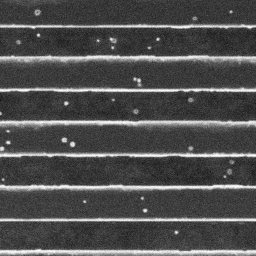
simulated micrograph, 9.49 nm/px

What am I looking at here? lines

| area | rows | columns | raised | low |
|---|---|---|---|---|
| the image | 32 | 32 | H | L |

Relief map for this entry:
HHHHHHHHHHHHHHHHHHHHHHHHHHHHHHHH
HHHHHHHHHHHHHHHHHHHHHHHHHHHHHHHH
HHHHHHHHHHHHHHHHHHHHHHHHHHHHHHHH
LLLLLLLLLLLLLLLLLLLLLLLLLLLLLLLL
LLLLLLLLLLLLLLLLLLLLLLLLLLLLLLLL
LLLLLLLLLLLLLLLLLLLLLLLLLLLLLLLL
LLLLLLLLLLLLLLLLLLLLLLLLLLLLLLLL
HHHHHHHHHHHHHHHHHHHHHHHHHHHHHHHH
HHHHHHHHHHHHHHHHHHHHHHHHHHHHHHHH
HHHHHHHHHHHHHHHHHHHHHHHHHHHHHHHH
HHHHHHHHHHHHHHHHHHHHHHHHHHHHHHHH
LLLLLLLLLLLLLLLLLLLLLLLLLLLLLLLL
LLLLLLLLLLLLLLLLLLLLLLLLLLLLLLLL
LLLLLLLLLLLLLLLLLLLLLLLLLLLLLLLL
LLLLLLLLLLLLLLLLLLLLLLLLLLLLLLLL
HHHHHHHHHHHHHHHHHHHHHHHHHHHHHHHH
HHHHHHHHHHHHHHHHHHHHHHHHHHHHHHHH
HHHHHHHHHHHHHHHHHHHHHHHHHHHHHHHH
HHHHHHHHHHHHHHHHHHHHHHHHHHHHHHHH
LLLLLLLLLLLLLLLLLLLLLLLLLLLLLLLL
LLLLLLLLLLLLLLLLLLLLLLLLLLLLLLLL
LLLLLLLLLLLLLLLLLLLLLLLLLLLLLLLL
LLLLLLLLLLLLLLLLLLLLLLLLLLLLLLLL
HHHHHHHHHHHHHHHHHHHHHHHHHHHHHHHH
HHHHHHHHHHHHHHHHHHHHHHHHHHHHHHHH
HHHHHHHHHHHHHHHHHHHHHHHHHHHHHHHH
HHHHHHHHHHHHHHHHHHHHHHHHHHHHHHHH
HHHHHHHHHHHHHHHHHHHHHHHHHHHHHHHH
LLLLLLLLLLLLLLLLLLLLLLLLLLLLLLLL
LLLLLLLLLLLLLLLLLLLLLLLLLLLLLLLL
LLLLLLLLLLLLLLLLLLLLLLLLLLLLLLLL
HHHHHHHHHHHHLLLHHLLLLLLLHHHHHLLH